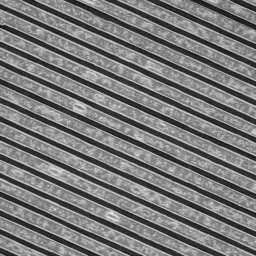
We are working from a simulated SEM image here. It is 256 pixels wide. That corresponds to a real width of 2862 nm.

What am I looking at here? parallel lines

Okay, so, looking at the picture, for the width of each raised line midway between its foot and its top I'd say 130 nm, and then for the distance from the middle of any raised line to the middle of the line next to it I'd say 191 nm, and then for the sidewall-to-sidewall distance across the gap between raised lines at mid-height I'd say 5.81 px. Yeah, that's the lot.